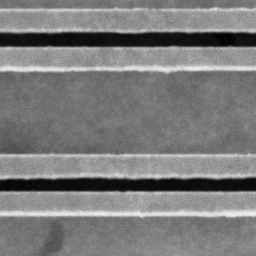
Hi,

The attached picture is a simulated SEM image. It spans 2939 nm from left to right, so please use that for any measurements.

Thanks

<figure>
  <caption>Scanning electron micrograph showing lines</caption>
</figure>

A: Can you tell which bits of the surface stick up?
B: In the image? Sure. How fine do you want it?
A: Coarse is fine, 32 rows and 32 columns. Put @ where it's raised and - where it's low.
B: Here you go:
--------------------------------
@@@@@@@@@@@@@@@@@@@@@@@@@@@@@@@@
@@@@@@@@@@@@@@@@@@@@@@@@@@@@@@@@
@@@@@@@@@@@@@@@@@@@@@@@@@@@@@@@@
--------------------------------
--------------------------------
@@@@@@@@@@@@@@@@@@@@@@@@@@@@@@@@
@@@@@@@@@@@@@@@@@@@@@@@@@@@@@@@@
@@@@@@@@@@@@@@@@@@@@@@@@@@@@@@@@
--------------------------------
--------------------------------
--------------------------------
--------------------------------
--------------------------------
--------------------------------
--------------------------------
--------------------------------
--------------------------------
--------------------------------
@@@@@@@@@@@@@@@@@@@@@@@@@@@@@@@@
@@@@@@@@@@@@@@@@@@@@@@@@@@@@@@@@
@@@@@@@@@@@@@@@@@@@@@@@@@@@@@@@@
--------------------------------
--------------------------------
@@@@@@@@@@@@@@@@@@@@@@@@@@@@@@@@
@@@@@@@@@@@@@@@@@@@@@@@@@@@@@@@@
@@@@@@@@@@@@@@@@@@@@@@@@@@@@@@@@
--------------------------------
--------------------------------
--------------------------------
--------------------------------
--------------------------------